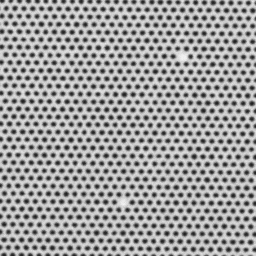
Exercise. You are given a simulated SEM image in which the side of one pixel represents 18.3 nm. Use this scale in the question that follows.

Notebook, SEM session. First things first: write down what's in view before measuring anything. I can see a regular array of holes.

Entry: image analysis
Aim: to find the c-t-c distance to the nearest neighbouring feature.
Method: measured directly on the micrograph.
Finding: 0.158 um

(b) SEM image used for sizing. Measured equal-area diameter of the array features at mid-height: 108 nm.